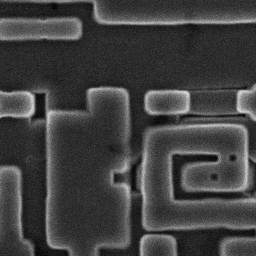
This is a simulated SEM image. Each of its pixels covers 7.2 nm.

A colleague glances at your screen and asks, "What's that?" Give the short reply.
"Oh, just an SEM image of wiring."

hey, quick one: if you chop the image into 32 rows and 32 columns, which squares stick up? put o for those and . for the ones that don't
............oooooooooooooooooooo
............oooooooooooooooooooo
ooo..ooooo..oooooooooooooooooooo
oooooooooo......................
oooooooooo......................
................................
................................
................................
................................
................................
................................
...........ooooo....ooo.......oo
oooo.......ooooo..oooooo......oo
oooo.......ooooo..oooooo......oo
ooo...oooooooooo...............o
......oooooooooo................
......oooooooooo..ooooooooooooo.
......oooooooooo..ooooooooooooo.
......oooooooooo..ooooooooooooo.
......oooooooooo..ooo......oooo.
......oooooooooo..ooo...ooooooo.
oo....ooooooooo...ooo..oooooooo.
oo....oooooooo....ooo..oooooooo.
oo....oooooooooo..oooo.ooooooo..
ooo...oooooooooo..oooo..........
ooo...oooooooooo..oooooooooooooo
ooo...oooooooooo..oooooooooooooo
ooo...oooooooooo..oooooooooooooo
ooo...oooooooooo..oooooo........
ooo...oooooooooo..ooo...........
oooo..oooooooooo..oooo......oooo
oooo.....ooo......oooo......oooo